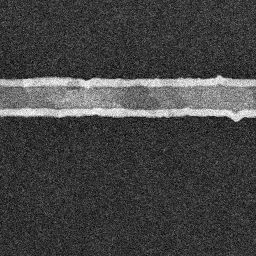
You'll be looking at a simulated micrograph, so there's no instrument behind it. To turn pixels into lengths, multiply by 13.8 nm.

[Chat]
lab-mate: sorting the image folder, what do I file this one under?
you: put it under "one or a few lines or trenches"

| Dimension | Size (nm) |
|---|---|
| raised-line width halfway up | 403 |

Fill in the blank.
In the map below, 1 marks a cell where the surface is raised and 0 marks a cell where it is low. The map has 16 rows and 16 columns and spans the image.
0000000000000000
0000000000000000
0000000000000000
0000000000000000
0000000000000000
1111111111111111
1111111111111111
0000000000000000
0000000000000000
0000000000000000
0000000000000000
0000000000000000
0000000000000000
0000000000000000
0000000000000000
0000000000000000